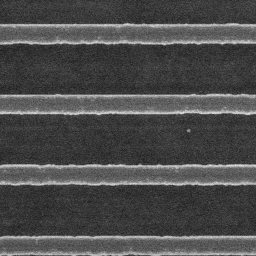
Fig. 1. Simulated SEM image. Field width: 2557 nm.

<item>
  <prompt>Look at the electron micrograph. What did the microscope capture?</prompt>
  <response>lines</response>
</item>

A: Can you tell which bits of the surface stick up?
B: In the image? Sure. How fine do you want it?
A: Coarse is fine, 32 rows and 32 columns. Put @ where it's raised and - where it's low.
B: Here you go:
--------------------------------
--------------------------------
--------------------------------
@@@@@@@@@@@@@@@@@@@@@@@@@@@@@@@@
@@@@@@@@@@@@@@@@@@@@@@@@@@@@@@@@
--------------------------------
--------------------------------
--------------------------------
--------------------------------
--------------------------------
--------------------------------
--------------------------------
@@@@@@@@@@@@@@@@@@@@@@@@@@@@@@@@
@@@@@@@@@@@@@@@@@@@@@@@@@@@@@@@@
--------------------------------
--------------------------------
--------------------------------
--------------------------------
--------------------------------
--------------------------------
--------------------------------
@@@@@@@@@@@@@@@@@@@@@@@@@@@@@@@@
@@@@@@@@@@@@@@@@@@@@@@@@@@@@@@@@
--------------------------------
--------------------------------
--------------------------------
--------------------------------
--------------------------------
--------------------------------
--------------------------------
@@@@@@@@@@@@@@@@@@@@@@@@@@@@@@@@
@@@@@@@@@@@@@@@@@@@@@@@@@@@@@@@@